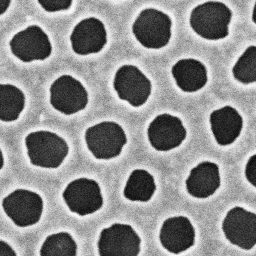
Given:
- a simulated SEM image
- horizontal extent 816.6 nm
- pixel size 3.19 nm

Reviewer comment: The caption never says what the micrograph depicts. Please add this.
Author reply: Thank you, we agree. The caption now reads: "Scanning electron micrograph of a regular array of holes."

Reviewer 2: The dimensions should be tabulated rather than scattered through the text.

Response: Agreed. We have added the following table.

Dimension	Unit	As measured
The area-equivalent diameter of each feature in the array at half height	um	0.122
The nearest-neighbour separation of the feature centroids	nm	185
